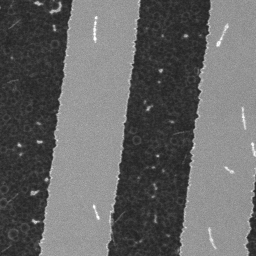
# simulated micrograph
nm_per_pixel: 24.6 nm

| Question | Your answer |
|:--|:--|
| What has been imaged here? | one or a few lines or trenches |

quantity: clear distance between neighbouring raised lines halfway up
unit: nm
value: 1640